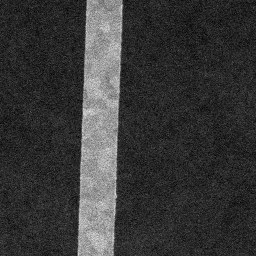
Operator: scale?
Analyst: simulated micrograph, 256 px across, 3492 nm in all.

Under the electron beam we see one or a few lines or trenches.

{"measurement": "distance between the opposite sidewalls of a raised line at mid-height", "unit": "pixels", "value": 35.3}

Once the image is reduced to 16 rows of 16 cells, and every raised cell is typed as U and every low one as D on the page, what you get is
DDDDDUUUDDDDDDDD
DDDDDUUUDDDDDDDD
DDDDDUUUDDDDDDDD
DDDDDUUUDDDDDDDD
DDDDDUUDDDDDDDDD
DDDDDUUDDDDDDDDD
DDDDDUUDDDDDDDDD
DDDDDUUDDDDDDDDD
DDDDDUUDDDDDDDDD
DDDDDUUDDDDDDDDD
DDDDDUUDDDDDDDDD
DDDDDUUDDDDDDDDD
DDDDDUUDDDDDDDDD
DDDDDUUDDDDDDDDD
DDDDDUUDDDDDDDDD
DDDDDUUDDDDDDDDD